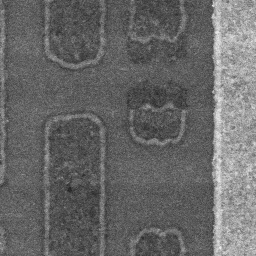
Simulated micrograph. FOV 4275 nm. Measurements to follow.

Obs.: one or a few lines or trenches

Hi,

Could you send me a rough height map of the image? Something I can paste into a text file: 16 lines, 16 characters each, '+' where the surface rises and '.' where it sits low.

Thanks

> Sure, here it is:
...+++..+++...++
...+++..+++...++
...+++........++
...+++........++
..............++
..............++
..............++
...+++..+++...++
...+++...++...++
...+++........++
...+++........++
...+++........++
...+++........++
...+++........++
...+++...++...++
...+++..+++...++